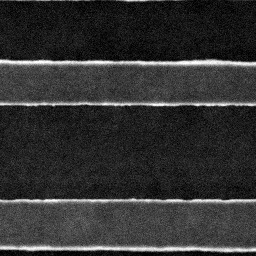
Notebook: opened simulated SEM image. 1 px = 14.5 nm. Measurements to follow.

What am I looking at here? lines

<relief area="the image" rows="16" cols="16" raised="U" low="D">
DDDDDDDDDDDDDDDD
DDDDDDDDDDDDDDDD
DDDDDDDDDDDDDDDD
DDDDDDDDDDDDDDDD
UUUUUUUUUUUUUUUU
UUUUUUUUUUUUUUUU
UUUUUUUUUUUUUUUU
DDDDDDDDDDDDDDDD
DDDDDDDDDDDDDDDD
DDDDDDDDDDDDDDDD
DDDDDDDDDDDDDDDD
DDDDDDDDDDDDDDDD
DDDDDDDDDDDDDDDD
UUUUUUUUUUUUUUUU
UUUUUUUUUUUUUUUU
UUUUUUUUUUUUUUUU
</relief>